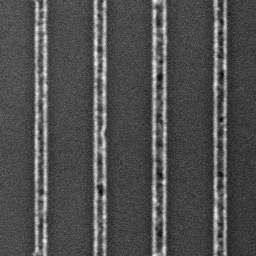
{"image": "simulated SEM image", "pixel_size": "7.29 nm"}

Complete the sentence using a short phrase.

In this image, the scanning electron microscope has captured parallel lines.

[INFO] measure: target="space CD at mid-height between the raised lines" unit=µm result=0.375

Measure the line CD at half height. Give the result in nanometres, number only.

64.7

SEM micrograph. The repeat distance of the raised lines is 436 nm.